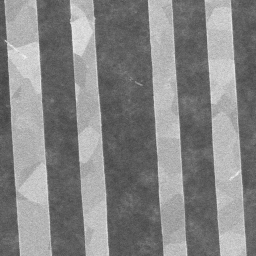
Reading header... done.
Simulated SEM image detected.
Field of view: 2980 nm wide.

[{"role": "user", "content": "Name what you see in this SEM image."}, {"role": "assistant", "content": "one or a few lines or trenches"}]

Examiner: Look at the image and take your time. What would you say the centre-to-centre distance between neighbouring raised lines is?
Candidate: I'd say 765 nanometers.